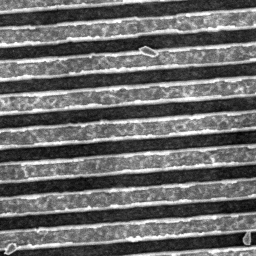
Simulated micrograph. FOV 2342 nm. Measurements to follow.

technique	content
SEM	parallel lines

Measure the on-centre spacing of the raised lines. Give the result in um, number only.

0.31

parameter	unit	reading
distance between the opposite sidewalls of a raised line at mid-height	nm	169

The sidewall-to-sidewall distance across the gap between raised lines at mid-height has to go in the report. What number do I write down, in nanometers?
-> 142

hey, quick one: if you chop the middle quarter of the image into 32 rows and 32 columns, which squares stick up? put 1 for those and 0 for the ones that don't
11111111111111111111111111111110
11111111111111111000000000000000
11110000000000000000000000000000
00000000000000000000000000000000
00000000000000000000000000000000
00000000000000000001111111111111
00000111111111111111111111111111
11111111111111111111111111111111
11111111111111111111111111111111
11111111111111111111111100000000
11111111111000000000000000000000
00000000000000000000000000000000
00000000000000000000000000000000
00000000000000000000000000111111
00000000011001111111111111111111
11111111111111111111111111111111
11111111111111111111111111111111
11111111111111111111111111111111
11111111111111101100000000000000
11111100000000000000000000000000
00000000000000000000000000000000
00000000000000000000000000000000
00000000000000000011111111111111
00000001111111111111111111111111
11111111111111111111111111111111
11111111111111111111111111111111
11111111111111111111111100000000
11111111111000000000000000000000
00000000000000000000000000000000
00000000000000000000000000000000
00000000000000000000000011111111
00000000000111111111111111111111